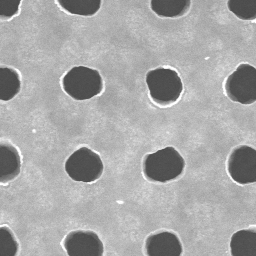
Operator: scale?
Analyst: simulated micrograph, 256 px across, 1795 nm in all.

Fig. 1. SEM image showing holes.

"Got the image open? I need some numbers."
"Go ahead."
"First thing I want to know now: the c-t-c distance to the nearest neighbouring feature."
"562 nm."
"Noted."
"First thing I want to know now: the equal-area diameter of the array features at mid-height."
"245 nm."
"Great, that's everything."